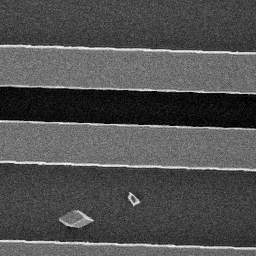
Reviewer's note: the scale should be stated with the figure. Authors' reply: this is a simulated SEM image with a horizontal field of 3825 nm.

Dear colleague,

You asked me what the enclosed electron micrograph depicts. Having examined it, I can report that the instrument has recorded lines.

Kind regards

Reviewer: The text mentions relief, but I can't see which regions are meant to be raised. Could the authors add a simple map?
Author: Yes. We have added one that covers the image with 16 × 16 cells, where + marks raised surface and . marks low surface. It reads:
................
................
................
++++++++++++++++
++++++++++++++++
.....+++++++++++
................
................
++++++++++++++++
++++++++++++++++
.............+++
................
................
................
................
++++++++++++++..